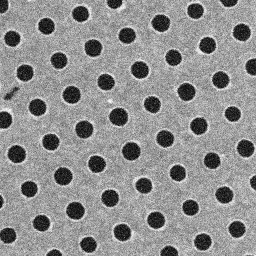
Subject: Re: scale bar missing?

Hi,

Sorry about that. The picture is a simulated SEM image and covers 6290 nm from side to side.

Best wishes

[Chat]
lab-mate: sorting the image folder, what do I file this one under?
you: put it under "a regular array of holes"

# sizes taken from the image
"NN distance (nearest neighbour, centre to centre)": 0.876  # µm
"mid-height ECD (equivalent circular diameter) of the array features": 0.458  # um